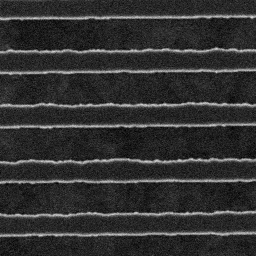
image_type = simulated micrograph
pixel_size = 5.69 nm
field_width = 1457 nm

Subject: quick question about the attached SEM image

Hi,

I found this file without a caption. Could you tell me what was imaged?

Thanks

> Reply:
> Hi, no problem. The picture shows lines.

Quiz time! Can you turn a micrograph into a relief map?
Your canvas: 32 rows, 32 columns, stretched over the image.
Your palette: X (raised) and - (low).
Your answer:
XXXXXXXXXXXXXXXXXXXXXXXXXXXXXXXX
XXXXXXXXXXXXXXXXXXXXXXXXXXXXXXXX
--------------------------------
--------------------------------
--------------------------------
--------------------------------
XXXXXXXXXXXXXXXXXXXXXXXXXXXXXXXX
XXXXXXXXXXXXXXXXXXXXXXXXXXXXXXXX
XXXXXXXXXXXXXXXXXXXXXXXXXXXXXXXX
--------------------------------
--------------------------------
--------------------------------
--------------------------------
XXXXXXXXXXXXXXXXXXXXXXXXXXXXXXXX
XXXXXXXXXXXXXXXXXXXXXXXXXXXXXXXX
XXXXXXXXXXXXXXXXXXXXXXXXXXXXXXXX
--------------------------------
--------------------------------
--------------------------------
--------------------------------
XXXXXXXXXXXXXXXXXXXXXXXXXXXXXXXX
XXXXXXXXXXXXXXXXXXXXXXXXXXXXXXXX
XXXXXXXXXXXXXXXXXXXXXXXXXXXXXXXX
--------------------------------
--------------------------------
--------------------------------
---------------------------XXXXX
XXXXXXXXXXXXXXXXXXXXXXXXXXXXXXXX
XXXXXXXXXXXXXXXXXXXXXXXXXXXXXXXX
--------------------------------
--------------------------------
--------------------------------